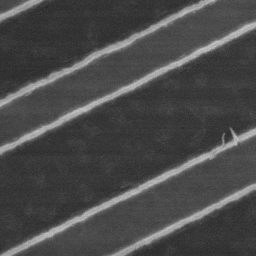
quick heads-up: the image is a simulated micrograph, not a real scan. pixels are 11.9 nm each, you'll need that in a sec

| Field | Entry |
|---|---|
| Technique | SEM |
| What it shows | one or a few lines or trenches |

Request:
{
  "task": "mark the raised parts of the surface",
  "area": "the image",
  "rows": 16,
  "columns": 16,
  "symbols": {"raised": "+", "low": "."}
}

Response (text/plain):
+...........++++
..........++++++
........++++++..
......++++++....
....++++++......
..++++++........
++++++..........
++++............
++.............+
.............+++
...........+++++
.........+++++++
.......+++++++..
.....+++++++....
...+++++++......
.+++++++........